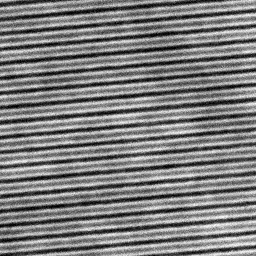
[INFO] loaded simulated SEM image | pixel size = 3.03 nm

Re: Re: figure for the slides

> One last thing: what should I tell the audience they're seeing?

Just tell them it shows parallel lines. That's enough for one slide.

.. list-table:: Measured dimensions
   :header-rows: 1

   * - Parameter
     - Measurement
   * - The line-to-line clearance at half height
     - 0.0162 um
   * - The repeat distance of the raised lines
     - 44.5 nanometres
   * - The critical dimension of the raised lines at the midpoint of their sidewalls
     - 27.1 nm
